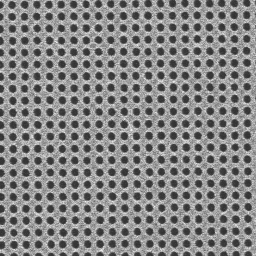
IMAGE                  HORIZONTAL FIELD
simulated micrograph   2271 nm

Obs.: a regular array of holes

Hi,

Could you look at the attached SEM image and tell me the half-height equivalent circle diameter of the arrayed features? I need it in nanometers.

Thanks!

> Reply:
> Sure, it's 68.6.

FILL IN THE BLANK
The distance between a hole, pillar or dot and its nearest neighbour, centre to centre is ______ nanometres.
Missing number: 104